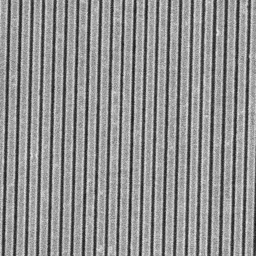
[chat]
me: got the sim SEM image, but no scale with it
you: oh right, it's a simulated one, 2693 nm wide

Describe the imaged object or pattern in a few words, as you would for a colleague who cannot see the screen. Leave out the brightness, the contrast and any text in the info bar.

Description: parallel lines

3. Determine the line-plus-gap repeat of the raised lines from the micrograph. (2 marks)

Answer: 120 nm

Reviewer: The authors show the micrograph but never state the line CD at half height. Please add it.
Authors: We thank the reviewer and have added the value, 81.5 nm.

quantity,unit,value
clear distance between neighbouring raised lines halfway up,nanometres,36.8